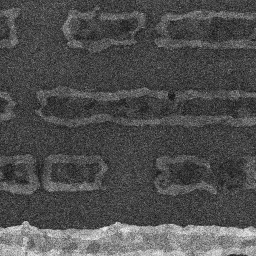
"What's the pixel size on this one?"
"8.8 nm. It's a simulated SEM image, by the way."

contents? one or a few lines or trenches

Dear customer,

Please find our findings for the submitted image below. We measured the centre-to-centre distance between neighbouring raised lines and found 636 nanometers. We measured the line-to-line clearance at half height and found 404 nanometers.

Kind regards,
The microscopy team